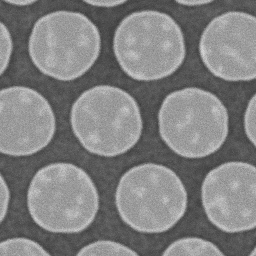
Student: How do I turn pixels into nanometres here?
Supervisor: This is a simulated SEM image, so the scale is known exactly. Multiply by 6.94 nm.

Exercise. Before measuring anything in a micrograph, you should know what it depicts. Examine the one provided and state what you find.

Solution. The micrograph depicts raised bodies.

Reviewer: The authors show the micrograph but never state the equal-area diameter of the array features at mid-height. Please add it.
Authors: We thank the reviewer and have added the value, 0.483 um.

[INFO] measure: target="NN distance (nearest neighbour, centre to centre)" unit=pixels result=86.3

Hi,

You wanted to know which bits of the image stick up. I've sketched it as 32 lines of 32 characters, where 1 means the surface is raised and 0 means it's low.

00100000000111100000000110000000
00000000000000000111000000000000
00000111111000011111100000011111
10001111111100011111110000111111
10001111111100111111111001111111
10001111111100111111111001111111
10001111111100111111111001111111
10001111111100011111111001111111
10000111111000011111110000111111
00000011110000001111100000011111
00000000000000000000000000000000
11111000000111110000001111000000
11111100001111111000011111100001
11111100011111111000111111110001
11111110011111111100111111110001
11111110011111111100111111110001
11111110011111111100111111110001
11111100001111111000011111110001
11111000000111110000011111100000
00000000000000000000000111000000
00000001000000000000000000001110
00000111110000001111110000111111
00001111111000011111110000111111
10001111111100011111111001111111
10001111111100011111111001111111
10001111111100011111111001111111
10001111111100011111111000111111
00001111111100011111110000111111
00000111111000000111100000001110
00000000000000000000000000000000
11111000000111100000001111000000
11111100001111111000011111110000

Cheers